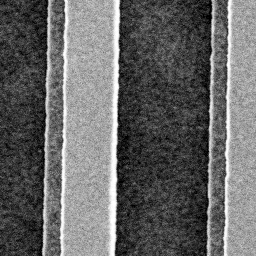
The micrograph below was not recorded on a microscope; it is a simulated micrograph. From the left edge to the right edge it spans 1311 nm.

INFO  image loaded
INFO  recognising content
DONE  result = lines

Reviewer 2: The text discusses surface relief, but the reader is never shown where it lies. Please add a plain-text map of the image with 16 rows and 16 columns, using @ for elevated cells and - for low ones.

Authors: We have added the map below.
---@@@@------@@@
---@@@@------@@@
---@@@@------@@@
---@@@@------@@@
---@@@@------@@@
---@@@@------@@@
---@@@@------@@@
---@@@@------@@@
---@@@@------@@@
---@@@@------@@@
---@@@@------@@@
---@@@@------@@@
---@@@@------@@@
---@@@@------@@@
---@@@@------@@@
---@@@@------@@@